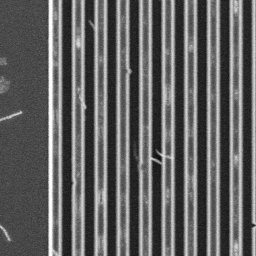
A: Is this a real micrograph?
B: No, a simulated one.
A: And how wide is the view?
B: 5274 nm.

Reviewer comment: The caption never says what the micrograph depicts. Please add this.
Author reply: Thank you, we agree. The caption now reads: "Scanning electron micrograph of parallel lines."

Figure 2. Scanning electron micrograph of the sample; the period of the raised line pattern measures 465 nm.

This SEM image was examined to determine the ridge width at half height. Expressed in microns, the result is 0.216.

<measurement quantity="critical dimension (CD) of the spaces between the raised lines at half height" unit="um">0.255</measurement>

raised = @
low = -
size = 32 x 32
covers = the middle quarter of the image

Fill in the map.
--@@@---@@---@@@---@@@---@@---@@
--@@@---@@---@@@---@@@---@@---@@
--@@@---@@---@@@---@@@---@@---@@
--@@@---@@---@@@---@@@---@@---@@
--@@@---@@---@@@---@@@---@@---@@
--@@@---@@---@@@---@@@---@@---@@
--@@@---@@---@@@---@@@---@@---@@
--@@@---@@---@@@---@@@---@@---@@
--@@@---@@---@@@---@@@---@@---@@
--@@@---@@---@@@---@@@---@@---@@
--@@@---@@---@@@---@@@---@@---@@
--@@@---@@---@@@---@@@---@@---@@
--@@@---@@---@@@---@@@---@@---@@
--@@@---@@---@@@---@@@---@@---@@
--@@@---@@---@@@---@@@---@@---@@
--@@@---@@---@@@---@@@---@@---@@
--@@@---@@---@@@---@@@---@@---@@
--@@@---@@---@@@---@@@---@@---@@
--@@@---@@---@@@---@@@---@@---@@
--@@@---@@---@@@---@@@---@@---@@
--@@@---@@---@@@---@@@---@@---@@
--@@@---@@---@@@---@@@---@@---@@
--@@@---@@---@@@---@@@--@@@---@@
--@@@---@@---@@@---@@@---@@---@@
--@@@---@@---@@@---@@@---@@---@@
--@@@---@@---@@@---@@@---@@---@@
--@@@---@@---@@@---@@@---@@---@@
--@@@---@@---@@@---@@@---@@---@@
--@@@---@@---@@@---@@@---@@---@@
--@@@---@@---@@@---@@@---@@---@@
--@@@---@@---@@@---@@@---@@---@@
--@@@---@@---@@@---@@@---@@---@@